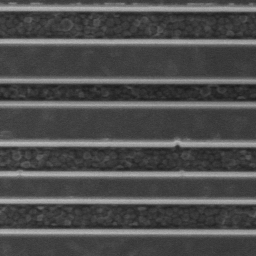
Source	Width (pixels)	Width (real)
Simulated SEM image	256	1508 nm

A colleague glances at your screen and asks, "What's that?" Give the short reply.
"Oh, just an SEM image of one or a few lines or trenches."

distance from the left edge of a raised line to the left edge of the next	372	nm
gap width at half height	0.173	micrometres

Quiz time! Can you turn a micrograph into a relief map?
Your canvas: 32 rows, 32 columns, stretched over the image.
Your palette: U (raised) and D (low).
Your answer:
UUUUUUUUUUUUUUUUUUUUUUUUUUUUUUUU
DDDDDDDDDDDDDDDDDDDDDDDDDDDDDDDD
DDDDDDDDDDDDDDDDDDDDDDDDDDDDDDDD
DDDDDDDDDDDDDDDDDDDDDDDDDDDDDDDD
DDDDDDDDDDDDDDDDDDDDDDDDDDDDDDDD
UUUUUUUUUUUUUUUUUUUUUUUUUUUUUUUU
UUUUUUUUUUUUUUUUUUUUUUUUUUUUUUUU
UUUUUUUUUUUUUUUUUUUUUUUUUUUUUUUU
UUUUUUUUUUUUUUUUUUUUUUUUUUUUUUUU
UUUUUUUUUUUUUUUUUUUUUUUUUUUUUUUU
DDDDDDDDDDDDDDDDDDDDDDDDDDDDDDDD
DDDDDDDDDDDDDDDDDDDDDDDDDDDDDDDD
DDDDDDDDDDDDDDDDDDDDDDDDDDDDDDDD
UUUUUUUUUUUUUUUUUUUUUUUUUUUUUUUU
UUUUUUUUUUUUUUUUUUUUUUUUUUUUUUUU
UUUUUUUUUUUUUUUUUUUUUUUUUUUUUUUU
UUUUUUUUUUUUUUUUUUUUUUUUUUUUUUUU
UUUUUUUUUUUUUUUUUUUUUUUUUUUUUUUU
DDDDDDDDDDDDDDDDDDDDDDDDDDDDDDDD
DDDDDDDDDDDDDDDDDDDDDDDDDDDDDDDD
DDDDDDDDDDDDDDDDDDDDDDDDDDDDDDDD
DDDDDDDDDDDDDDDDDDDDDDDDDDDDDDDD
UUUUUUUUUUUUUUUUUUUUUUUUUUUUUUUU
UUUUUUUUUUUUUUUUUUUUUUUUUUUUUUUU
UUUUUUUUUUUUUUUUUUUUUUUUUUUUUUUU
DDDDDDDDDDDDDDDDDDDDDDDDDDDDDDDD
DDDDDDDDDDDDDDDDDDDDDDDDDDDDDDDD
DDDDDDDDDDDDDDDDDDDDDDDDDDDDDDDD
DDDDDDDDDDDDDDDDDDDDDDDDDDDDDDDD
UUUUUUUUUUUUUUUUUUUUUUUUUUUUUUUU
UUUUUUUUUUUUUUUUUUUUUUUUUUUUUUUU
UUUUUUUUUUUUUUUUUUUUUUUUUUUUUUUU